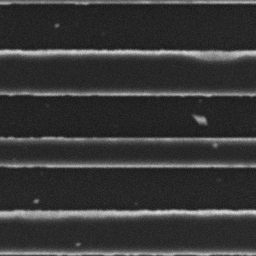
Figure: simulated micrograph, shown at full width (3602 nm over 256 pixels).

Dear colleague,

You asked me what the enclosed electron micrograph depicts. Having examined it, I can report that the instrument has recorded lines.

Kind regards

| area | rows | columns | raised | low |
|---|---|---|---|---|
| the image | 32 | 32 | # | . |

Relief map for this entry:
................................
................................
................................
................................
................................
................................
..#......#.#.##.....#...........
################################
################################
################################
################################
################################
................................
................................
................................
................................
................................
################################
################################
################################
################################
................................
................................
................................
................................
................................
.....................##.....#.##
################################
################################
################################
################################
################################